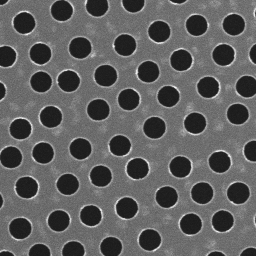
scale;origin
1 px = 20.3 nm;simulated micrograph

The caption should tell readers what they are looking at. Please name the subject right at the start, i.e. a regular array of holes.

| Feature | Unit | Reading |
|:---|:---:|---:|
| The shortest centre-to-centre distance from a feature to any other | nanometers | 670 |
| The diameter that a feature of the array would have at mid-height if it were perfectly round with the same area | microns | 0.443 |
